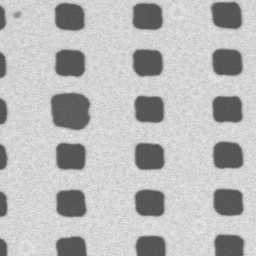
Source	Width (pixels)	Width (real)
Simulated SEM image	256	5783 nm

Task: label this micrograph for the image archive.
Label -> a regular array of holes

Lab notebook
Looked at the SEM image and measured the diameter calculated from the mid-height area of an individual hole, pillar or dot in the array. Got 0.677 microns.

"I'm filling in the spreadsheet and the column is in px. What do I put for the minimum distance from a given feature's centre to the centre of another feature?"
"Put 46.2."